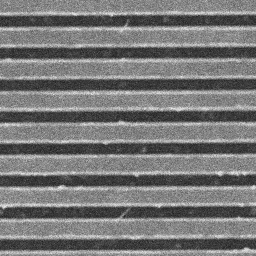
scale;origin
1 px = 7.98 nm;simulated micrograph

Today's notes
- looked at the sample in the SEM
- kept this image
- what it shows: parallel lines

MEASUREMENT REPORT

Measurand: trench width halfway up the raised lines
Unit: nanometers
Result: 114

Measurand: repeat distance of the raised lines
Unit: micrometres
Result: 0.255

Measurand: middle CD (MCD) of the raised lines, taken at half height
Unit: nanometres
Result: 142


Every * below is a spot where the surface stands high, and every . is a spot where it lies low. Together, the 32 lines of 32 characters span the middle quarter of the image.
********************************
********************************
********************************
..................*.............
................................
................................
................................
********************************
********************************
********************************
********************************
............................**..
................................
................................
..............*.................
********************************
********************************
********************************
********************************
*........***................****
................................
................................
................................
********************************
********************************
********************************
********************************
.................**...*.........
................................
................................
................................
********************************